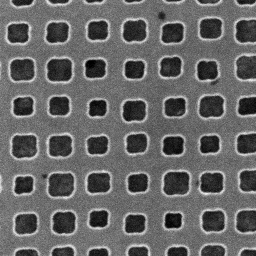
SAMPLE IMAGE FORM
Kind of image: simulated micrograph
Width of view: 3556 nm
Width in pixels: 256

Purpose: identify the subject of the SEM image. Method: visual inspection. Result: a regular array of holes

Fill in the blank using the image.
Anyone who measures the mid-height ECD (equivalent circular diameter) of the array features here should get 309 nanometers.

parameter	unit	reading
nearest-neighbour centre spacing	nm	505